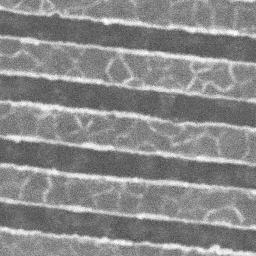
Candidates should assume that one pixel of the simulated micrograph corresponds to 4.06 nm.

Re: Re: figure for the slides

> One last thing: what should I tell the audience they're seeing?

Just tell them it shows one or a few lines or trenches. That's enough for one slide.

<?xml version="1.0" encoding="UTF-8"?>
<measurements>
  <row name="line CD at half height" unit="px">36.8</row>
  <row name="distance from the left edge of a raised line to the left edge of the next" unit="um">0.259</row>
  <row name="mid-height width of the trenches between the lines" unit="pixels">26.5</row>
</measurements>